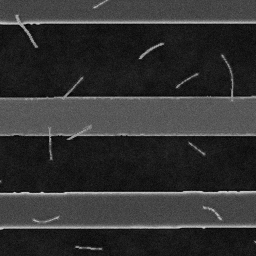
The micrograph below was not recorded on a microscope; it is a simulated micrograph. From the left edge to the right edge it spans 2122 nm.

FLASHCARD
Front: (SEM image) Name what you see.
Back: lines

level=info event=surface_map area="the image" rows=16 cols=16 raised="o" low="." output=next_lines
oooooooooooooooo
.o..............
................
................
................
................
oooooooooooooooo
oooooooooooooooo
................
................
................
................
oooooooooooooooo
oooooooooooooooo
................
................